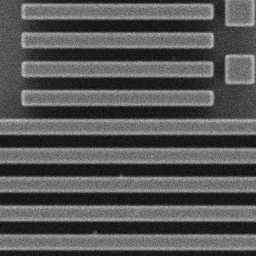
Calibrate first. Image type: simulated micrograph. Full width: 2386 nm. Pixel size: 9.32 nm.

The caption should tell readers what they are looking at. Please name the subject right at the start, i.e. groups of lines, slits or small figures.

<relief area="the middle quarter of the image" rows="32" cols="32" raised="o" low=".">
oooooooooooooooooooooooooooooooo
oooooooooooooooooooooooooooooooo
oooooooooooooooooooooooooooooooo
................................
................................
................................
................................
oooooooooooooooooooooooooooooooo
oooooooooooooooooooooooooooooooo
oooooooooooooooooooooooooooooooo
................................
................................
................................
................................
oooooooooooooooooooooooooooooooo
oooooooooooooooooooooooooooooooo
oooooooooooooooooooooooooooooooo
oooooooooooooooooooooooooooooooo
................................
................................
................................
oooooooooooooooooooooooooooooooo
oooooooooooooooooooooooooooooooo
oooooooooooooooooooooooooooooooo
oooooooooooooooooooooooooooooooo
................................
................................
................................
oooooooooooooooooooooooooooooooo
oooooooooooooooooooooooooooooooo
oooooooooooooooooooooooooooooooo
oooooooooooooooooooooooooooooooo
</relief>